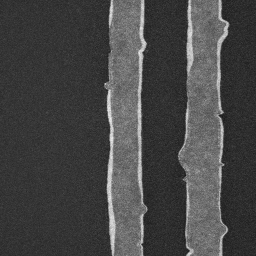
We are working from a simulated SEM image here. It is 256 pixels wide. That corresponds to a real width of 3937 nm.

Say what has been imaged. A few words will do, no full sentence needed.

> one or a few lines or trenches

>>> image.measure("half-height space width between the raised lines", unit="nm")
715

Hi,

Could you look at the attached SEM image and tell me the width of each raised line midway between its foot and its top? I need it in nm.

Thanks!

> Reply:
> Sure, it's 486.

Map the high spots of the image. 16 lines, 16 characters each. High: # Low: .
.......##...##..
.......##...##..
.......##...##..
.......##...##..
.......##...##..
.......##...##..
.......##...##..
.......##...##..
.......##...##..
.......##..###..
.......##..###..
.......##...##..
.......##...##..
.......##...##..
.......##...##..
.......##...##..